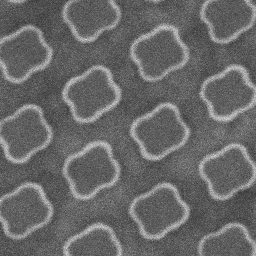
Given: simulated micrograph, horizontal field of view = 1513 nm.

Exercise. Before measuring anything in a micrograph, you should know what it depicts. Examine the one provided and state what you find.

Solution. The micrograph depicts raised bodies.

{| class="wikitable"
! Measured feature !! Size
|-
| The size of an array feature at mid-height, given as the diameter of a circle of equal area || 50.1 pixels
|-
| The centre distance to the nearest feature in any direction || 0.462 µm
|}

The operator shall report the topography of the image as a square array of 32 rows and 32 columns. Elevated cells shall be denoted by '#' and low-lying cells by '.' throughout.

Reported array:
........######............#####.
........#######..........#######
........#######...........######
...#.....####.......#.....#####.
.####.....##......####....###...
######...........######.........
######...........######.........
######...........######.........
.####.......#.....####.......#..
.##.......####....##.......####.
.........#####...........######.
........#######..........#######
........#######...........######
...##....#####......##....#####.
..###....###......####.....##...
######...........######.........
######...........######.........
######...........######.........
.####......###....####......##..
.###.....#####....##......#####.
........######...........#######
........#######..........#######
.........#####............######
...##....####......###....####..
.####.....#.......####.....##...
######...........######.........
######..........#######.........
######...........######.........
.###.......##.....###.......##..
.##.......####.....#......#####.
........#######..........#######
........#######..........#######